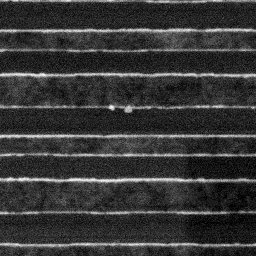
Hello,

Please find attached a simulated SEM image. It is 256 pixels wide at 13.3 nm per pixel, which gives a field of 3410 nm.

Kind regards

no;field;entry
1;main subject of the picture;lines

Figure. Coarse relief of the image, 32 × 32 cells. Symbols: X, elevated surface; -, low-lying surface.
--------------------------------
--------------------------------
--------------------------------
--------------------------------
XXXXXXXXXXXXXXXXXXXXXXXXXXXXXXXX
XXXXXXXXXXXXXXXXXXXXXXXXXXXXXXXX
--------------------------------
--------------------------------
--------------------------------
XXXXXXXXXXXXXXXXXXXXXXXXXXXXX-XX
XXXXXXXXXXXXXXXXXXXXXXXXXXXXXXXX
XXXXXXXXXXXXXXXXXXXXXXXXXXXXXXXX
XXXXXXXXXXXXXXXXXXXXXXXXXXXXXXXX
---------------XX---------------
--------------------------------
--------------------------------
--------------------------------
XXXXXXXXXXXXXXXXXXXXXXXXXXXXXXXX
XXXXXXXXXXXXXXXXXXXXXXXXXXXXXXXX
--------------------------------
--------------------------------
--------------------------------
XXXXX--------------XXX----------
XXXXXXXXXXXXXXXXXXXXXXXXXXXXXXXX
XXXXXXXXXXXXXXXXXXXXXXXXXXXXXXXX
XXXXXXXXXXXXXXXXXXXXXXXXXXXXXXXX
XXXXXXXXXXXXXXXXXXXXXXXXXXXXXXXX
--------------------------------
--------------------------------
--------------------------------
--------------------------------
XXXXXXXXXXXXXXXXXXXXXXXXXXXXXXXX